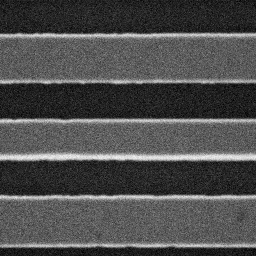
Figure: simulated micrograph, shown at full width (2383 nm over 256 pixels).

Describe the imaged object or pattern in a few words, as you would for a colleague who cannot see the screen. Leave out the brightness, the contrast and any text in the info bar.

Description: lines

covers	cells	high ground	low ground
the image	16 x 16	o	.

................
................
oooooooooooooooo
oooooooooooooooo
oooooooooooooooo
................
................
.......oo.o.o..o
oooooooooooooooo
oooooooooooooooo
................
................
oooooooooooooooo
oooooooooooooooo
oooooooooooooooo
................